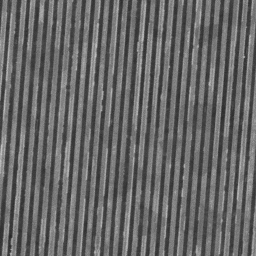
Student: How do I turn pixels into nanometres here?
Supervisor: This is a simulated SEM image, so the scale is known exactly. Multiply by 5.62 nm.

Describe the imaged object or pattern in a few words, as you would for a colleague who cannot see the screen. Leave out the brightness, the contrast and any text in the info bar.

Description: parallel lines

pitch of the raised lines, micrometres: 0.0517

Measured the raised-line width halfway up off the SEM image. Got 0.0224 micrometres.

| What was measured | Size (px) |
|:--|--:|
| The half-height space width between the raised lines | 4.86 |